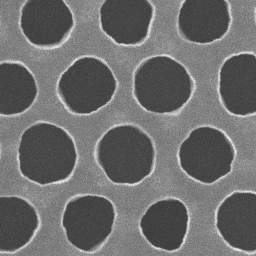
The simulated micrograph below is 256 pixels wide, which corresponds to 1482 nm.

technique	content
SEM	holes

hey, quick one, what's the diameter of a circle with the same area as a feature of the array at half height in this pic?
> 318 nm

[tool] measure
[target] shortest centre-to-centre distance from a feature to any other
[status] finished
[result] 444 nm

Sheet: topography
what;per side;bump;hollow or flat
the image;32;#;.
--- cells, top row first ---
###.....#####......####.....####
###......####......###.......###
###......####......###.......###
###......####......###......####
###.....######....#####.....####
#####.##########.###############
################################
##########..######....######....
...######.....###......#####....
....####......###.......###.....
.....##.......###.......###.....
.....###......###.......####....
....####......###......#####....
...######...######....######....
################################
#####.##########################
###.....#####.....######....####
###......####......####......###
##.......###.......####......###
##........##.......###.......###
##.......###.......####......###
###......####......####......###
####...#######....#######..#####
################################
###########.#################...
....#####.....#####....#####....
....####......####.....####.....
.....###......####.....####.....
....####......####.....####.....
....####......####.....#####....
...######....######....######...
################################